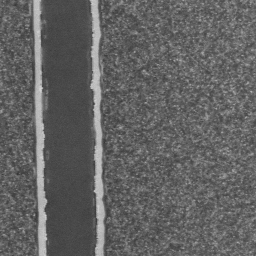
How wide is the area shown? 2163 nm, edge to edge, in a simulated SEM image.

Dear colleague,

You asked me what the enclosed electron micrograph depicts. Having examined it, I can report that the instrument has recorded one or a few lines or trenches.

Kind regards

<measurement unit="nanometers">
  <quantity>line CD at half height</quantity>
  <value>496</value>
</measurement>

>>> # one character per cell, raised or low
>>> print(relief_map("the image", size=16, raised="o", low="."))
..oooo..........
..oooo..........
..oooo..........
..oooo..........
..oooo..........
..oooo..........
..oooo..........
..oooo..........
..oooo..........
..oooo..........
...ooo..........
...ooo..........
...ooo..........
...ooo..........
...ooo..........
...ooo..........